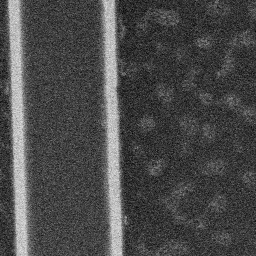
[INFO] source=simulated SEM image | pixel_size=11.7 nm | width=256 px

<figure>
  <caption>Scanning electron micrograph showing one or a few lines or trenches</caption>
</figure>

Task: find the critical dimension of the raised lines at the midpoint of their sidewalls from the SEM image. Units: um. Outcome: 1.12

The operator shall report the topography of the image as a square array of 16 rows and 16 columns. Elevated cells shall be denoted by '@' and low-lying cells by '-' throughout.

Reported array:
-@@@@@@---------
-@@@@@@---------
-@@@@@@---------
-@@@@@@---------
-@@@@@@---------
-@@@@@@---------
-@@@@@@---------
-@@@@@@---------
-@@@@@@---------
-@@@@@@---------
-@@@@@@---------
-@@@@@@---------
-@@@@@@---------
-@@@@@@---------
-@@@@@@---------
-@@@@@@---------